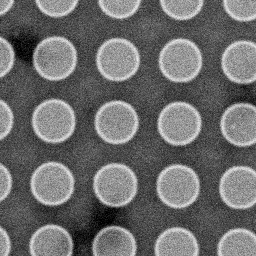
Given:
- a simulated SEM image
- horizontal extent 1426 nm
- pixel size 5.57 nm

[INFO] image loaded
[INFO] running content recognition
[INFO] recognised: an array of small figures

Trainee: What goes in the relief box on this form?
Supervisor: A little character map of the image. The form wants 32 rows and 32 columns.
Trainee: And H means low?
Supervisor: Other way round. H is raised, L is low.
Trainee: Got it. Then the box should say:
HLLLLHHHHLLLLHHHHLLLHHHHHLLLHHHH
HLLLLLHHHLLLLHHHHLLLLHHHHLLLHHHH
LLLLLLLLLLLLLLLLLLLLLLLLLLLLLLLL
LLLLLLLLLLLLLLLLLLLLLLLLLLLLLLLL
LLLLLLLLLLLLLLLLLLLLLLLLLLLLLLLL
HLLLLHHHHLLLLHHHLLLLLHHHLLLLLHHH
HHLLHHHHHLLLHHHHHLLLHHHHHLLLHHHH
HHLLHHHHHHLLHHHHHLLLHHHHHLLLHHHH
HLLLLHHHHLLLHHHHHLLLHHHHHLLLHHHH
LLLLLHHHLLLLLHHHLLLLLHHHLLLLHHHH
LLLLLLLLLLLLLLLLLLLLLLLLLLLLLLLL
LLLLLLLLLLLLLLLLLLLLLLLLLLLLLLLL
LLLLLLLLLLLLLLLLLLLLLLLLLLLLLLLL
HLLLLHHHHLLLLHHHLLLLLHHHLLLLLHHH
HLLLHHHHHLLLHHHHHLLLHHHHHLLLHHHH
HLLLHHHHHLLLHHHHHLLLHHHHHLLLHHHH
HLLLLHHHHLLLHHHHHLLLHHHHHLLLHHHH
LLLLLLHHLLLLLHHHLLLLLHHHLLLLLHHH
LLLLLLLLLLLLLLLLLLLLLLLLLLLLLLLL
LLLLLLLLLLLLLLLLLLLLLLLLLLLLLLLL
LLLLLLHLLLLLLLLLLLLLLLLLLLLLLLLL
HLLLHHHHHLLLHHHHLLLLHHHHLLLLHHHH
HLLLHHHHHLLLHHHHHLLLHHHHHLLLHHHH
HLLLHHHHHLLLHHHHHLLLHHHHHLLLHHHH
HLLLHHHHHLLLHHHHHLLLHHHHHLLLHHHH
LLLLLLHLLLLLLHHHLLLLLHHHLLLLLHHH
LLLLLLLLLLLLLLLLLLLLLLLLLLLLLLLL
LLLLLLLLLLLLLLLLLLLLLLLLLLLLLLLL
LLLLLHHHLLLLLHHLLLLLLLLLLLLLLLLL
HLLLHHHHHLLLHHHHLLLLHHHHLLLLHHHH
HLLLHHHHHLLLHHHHHLLLHHHHHLLHHHHH
HLLLHHHHHLLLHHHHHLLHHHHHHLLHHHHH